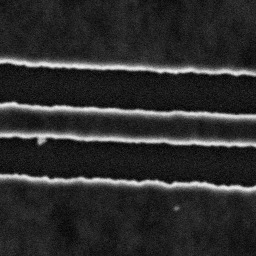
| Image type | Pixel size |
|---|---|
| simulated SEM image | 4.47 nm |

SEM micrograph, lines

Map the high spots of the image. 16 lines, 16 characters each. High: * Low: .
****************
****************
****************
****************
..........*.****
................
*...............
****************
****************
................
................
*************...
****************
****************
****************
****************